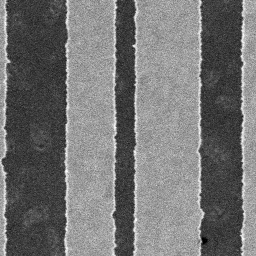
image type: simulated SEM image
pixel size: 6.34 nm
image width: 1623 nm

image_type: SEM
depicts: one or a few lines or trenches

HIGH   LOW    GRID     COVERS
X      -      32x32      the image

X-------XXXXXX---XXXXXXXX-----XX
X-------XXXXXX---XXXXXXXX-----XX
X-------XXXXXX---XXXXXXXX-----XX
X-------XXXXXX---XXXXXXXX-----XX
X--------XXXXX---XXXXXXXX-----XX
X-------XXXXXX---XXXXXXXX-----XX
X-------XXXXXX---XXXXXXXX-----XX
X-------XXXXXX---XXXXXXXX-----XX
X-------XXXXXX---XXXXXXXX-----XX
X-------XXXXXX---XXXXXXXX-----XX
X-------XXXXXX---XXXXXXXX-----XX
X-------XXXXXX---XXXXXXXX-----XX
X-------XXXXXX---XXXXXXXX-----XX
X-------XXXXXX---XXXXXXXX-----XX
X-------XXXXXX---XXXXXXXX-----XX
X-------XXXXXX---XXXXXXXX-----XX
X-------XXXXXX---XXXXXXXX-----XX
X-------XXXXXX---XXXXXXXX-----XX
X-------XXXXXX---XXXXXXXX-----XX
--------XXXXXX---XXXXXXXX-----XX
--------XXXXXX---XXXXXXXX-----XX
--------XXXXXX---XXXXXXXX-----XX
X-------XXXXXX---XXXXXXXX-----XX
X-------XXXXXX---XXXXXXXX-----XX
X-------XXXXXX---XXXXXXXX-----XX
X-------XXXXXX---XXXXXXXX-----XX
--------XXXXXX---XXXXXXXX------X
X--X----XXXXXX---XXXXXXXX------X
X-------XXXXXX---XXXXXXXX-----XX
X-------XXXXXX---XXXXXXXX-----XX
X-------XXXXXX---XXXXXXXX-----XX
X-------XXXXXX---XXXXXXXX-----XX